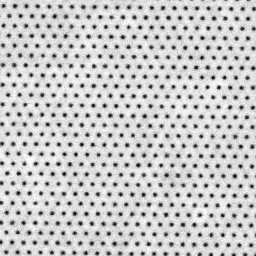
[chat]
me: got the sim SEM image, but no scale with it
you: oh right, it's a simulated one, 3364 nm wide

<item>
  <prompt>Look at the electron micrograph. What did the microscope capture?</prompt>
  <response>a regular array of holes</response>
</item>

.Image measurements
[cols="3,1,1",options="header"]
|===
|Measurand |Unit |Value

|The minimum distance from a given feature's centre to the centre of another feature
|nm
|144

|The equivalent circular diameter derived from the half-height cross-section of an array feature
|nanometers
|55.5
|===